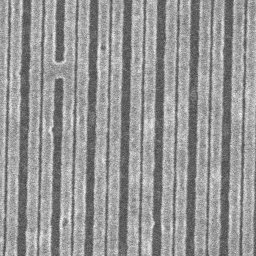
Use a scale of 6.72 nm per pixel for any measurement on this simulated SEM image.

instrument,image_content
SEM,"parallel lines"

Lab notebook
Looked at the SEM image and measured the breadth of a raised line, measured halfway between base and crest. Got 0.0689 micrometres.